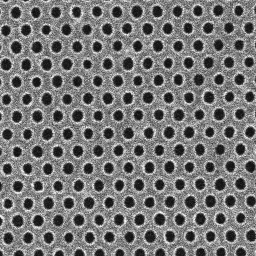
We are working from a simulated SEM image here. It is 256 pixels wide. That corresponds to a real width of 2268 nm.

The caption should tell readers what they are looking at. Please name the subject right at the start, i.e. a regular array of holes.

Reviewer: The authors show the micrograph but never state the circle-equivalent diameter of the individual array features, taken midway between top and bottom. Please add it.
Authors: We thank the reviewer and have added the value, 92.4 nm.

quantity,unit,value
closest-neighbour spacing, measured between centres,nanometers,174